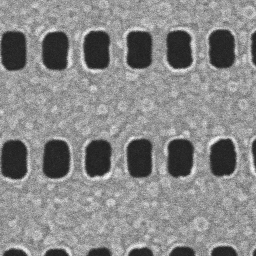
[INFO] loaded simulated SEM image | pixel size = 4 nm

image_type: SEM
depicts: a regular array of holes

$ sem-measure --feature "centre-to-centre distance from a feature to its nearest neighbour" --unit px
41.4